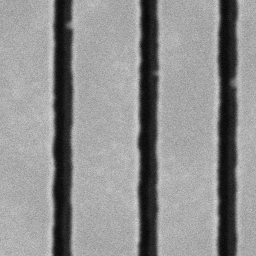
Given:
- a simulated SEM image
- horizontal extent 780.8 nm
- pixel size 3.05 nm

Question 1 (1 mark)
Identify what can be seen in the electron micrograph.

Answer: lines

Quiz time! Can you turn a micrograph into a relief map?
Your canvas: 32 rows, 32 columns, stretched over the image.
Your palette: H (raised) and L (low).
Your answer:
HHHHHHHLLHHHHHHHHLLLHHHHHHHLLLHH
HHHHHHHLLHHHHHHHHHLLHHHHHHHLLLHH
HHHHHHHLLHHHHHHHHLLLHHHHHHHLLLHH
HHHHHHHLLHHHHHHHHHLLHHHHHHHLLLHH
HHHHHHHLLHHHHHHHHHLLHHHHHHHLLLHH
HHHHHHHLLHHHHHHHHLLLHHHHHHHLLLHH
HHHHHHHLLHHHHHHHHLLLHHHHHHHLLLHH
HHHHHHHLLHHHHHHHHHLLHHHHHHHLLLHH
HHHHHHHLLHHHHHHHHLLLHHHHHHHLLLHH
HHHHHHHLLHHHHHHHHLLLHHHHHHHLLLHH
HHHHHHHLLHHHHHHHHLLLHHHHHHHLLLHH
HHHHHHHLLHHHHHHHHLLLHHHHHHHLLLHH
HHHHHHHLLHHHHHHHHLLLHHHHHHHLLLHH
HHHHHHHLLHHHHHHHHLLLHHHHHHHLLLHH
HHHHHHHLLHHHHHHHHLLLHHHHHHHLLLHH
HHHHHHHLLHHHHHHHHLLLHHHHHHHLLLHH
HHHHHHHLLHHHHHHHHLLLHHHHHHHLLLHH
HHHHHHHLLHHHHHHHHLLLHHHHHHHLLLHH
HHHHHHHLLHHHHHHHHLLLHHHHHHHLLLHH
HHHHHHHLLHHHHHHHHLLLHHHHHHHLLLHH
HHHHHHHLLHHHHHHHHLLLHHHHHHHLLLHH
HHHHHHHLLHHHHHHHHLLLHHHHHHHLLLHH
HHHHHHHLLHHHHHHHHLLLHHHHHHHLLLHH
HHHHHHHLLHHHHHHHHLLLHHHHHHHLLLHH
HHHHHHHLLHHHHHHHHLLLHHHHHHHLLLHH
HHHHHHHLLHHHHHHHHLLLHHHHHHHLLLHH
HHHHHHHLLHHHHHHHHLLLHHHHHHHLLLHH
HHHHHHHLLHHHHHHHHLLLHHHHHHHLLLHH
HHHHHHHLLHHHHHHHHLLLHHHHHHHLLLHH
HHHHHHHLLHHHHHHHHLLLHHHHHHHLLLHH
HHHHHHHLLHHHHHHHHLLLHHHHHHHLLLHH
HHHHHHHLLHHHHHHHHLLLHHHHHHHLLLHH